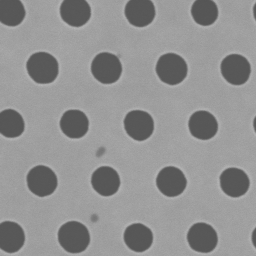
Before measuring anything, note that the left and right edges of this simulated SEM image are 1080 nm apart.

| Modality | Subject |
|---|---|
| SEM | a regular array of holes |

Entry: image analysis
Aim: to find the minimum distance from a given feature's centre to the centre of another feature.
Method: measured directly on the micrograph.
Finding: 270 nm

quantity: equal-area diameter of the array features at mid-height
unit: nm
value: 129